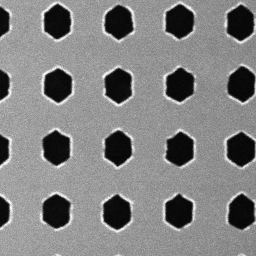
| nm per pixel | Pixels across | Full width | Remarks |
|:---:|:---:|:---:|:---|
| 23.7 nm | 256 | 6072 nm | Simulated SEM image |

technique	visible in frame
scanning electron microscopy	a regular array of holes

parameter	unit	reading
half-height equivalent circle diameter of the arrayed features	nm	746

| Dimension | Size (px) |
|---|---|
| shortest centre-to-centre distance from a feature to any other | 60.8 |